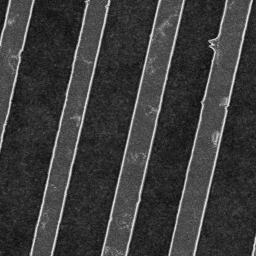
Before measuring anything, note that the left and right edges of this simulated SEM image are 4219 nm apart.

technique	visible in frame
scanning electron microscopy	one or a few lines or trenches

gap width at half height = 812 nanometers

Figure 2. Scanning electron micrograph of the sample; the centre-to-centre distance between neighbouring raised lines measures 1130 nm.